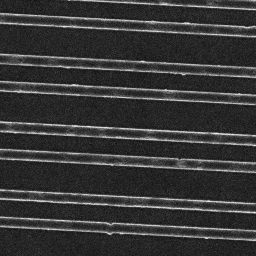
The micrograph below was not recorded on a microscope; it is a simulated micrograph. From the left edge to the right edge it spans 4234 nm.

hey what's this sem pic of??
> parallel lines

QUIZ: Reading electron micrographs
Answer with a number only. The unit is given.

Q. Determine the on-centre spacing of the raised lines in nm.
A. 561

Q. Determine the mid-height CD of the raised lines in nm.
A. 167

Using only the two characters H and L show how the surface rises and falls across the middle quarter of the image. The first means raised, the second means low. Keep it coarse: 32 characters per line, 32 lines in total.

HHHHHHHHHHHHHHHHHHHHHHHHHHHHHHHH
LLLLLLLLLLLLLHHHHHHHHHHHHHHHHHHH
LLLLLLLLLLLLLLLLLLLLLLLLLLLLLHHL
LLLLLLLLLLLLLLLLLLLLLLLLLLLLLLLL
LLLLLLLLLLLLLLLLLLLLLLLLLLLLLLLL
HHHHHLLLLLLLLLLLLLLLLLLLLLLLLLLL
HHHHHHHHHHHHHHHHHHHHHHHHLHLLLLLL
HHHHHHHHHHHHHHHHHHHHHHHHHHHHHHHH
LLLLLLLLLLLLLLLLLHHHHHHHHHHHHHHH
LLLLLLLLLLLLLLLLLLLLLLLLLLLLLLLL
LLLLLLLLLLLLLLLLLLLLLLLLLLLLLLLL
LLLLLLLLLLLLLLLLLLLLLLLLLLLLLLLL
LLLLLLLLLLLLLLLLLLLLLLLLLLLLLLLL
LLLLLLLLLLLLLLLLLLLLLLLLLLLLLLLL
LLLLLLLLLLLLLLLLLLLLLLLLLLLLLLLL
HHHHLLLLLLLLLLLLLLLLLLLLLLLLLLLL
HHHHHHHHHHHHHHHHHHHHHHHHLLLLLLLL
HHHHHHHHHHHHHHHHHHHHHHHHHHHHHHHH
LLLLLLLLLLLLLLHHHHHHHHHHHHHHHHHH
LLLLLLLLLLLLLLLLLLLLLLLLLLLLLLLL
LLLLLLLLLLLLLLLLLLLLLLLLLLLLLLLL
LLLLLLLLLLLLLLLLLLLLLLLLLLLLLLLL
HHHHHLLLLLLLLLLLLLLLLLLLLLLLLLLL
HHHHHHHHHHHHHHHHHHHHHHHHLLLLLLLL
HHHHHHHHHHHHHHHHHHHHHHHHHHHHHHHH
LLLLLLLLLLLLLLLLLLHHHHHHHHHHHHHH
LLLLLLLLLLLLLLLLLLLLLLLLLLLLLLLL
LLLLLLLLLLLLLLLLLLLLLLLLLLLLLLLL
LLLLLLLLLLLLLLLLLLLLLLLLLLLLLLLL
LLLLLLLLLLLLLLLLLLLLLLLLLLLLLLLL
LLLLLLLLLLLLLLLLLLLLLLLLLLLLLLLL
LLLLLLLLLLLLLLLLLLLLLLLLLLLLLLLL